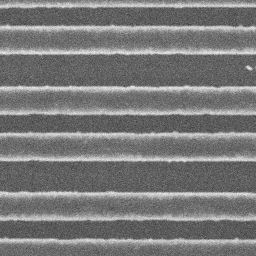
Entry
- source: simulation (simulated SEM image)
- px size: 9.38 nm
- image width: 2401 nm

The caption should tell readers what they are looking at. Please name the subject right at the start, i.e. lines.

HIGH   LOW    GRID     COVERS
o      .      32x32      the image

oooooooooooooooooooooooooooooooo
................................
................................
oooooooooooooooooooooooooooooooo
oooooooooooooooooooooooooooooooo
oooooooooooooooooooooooooooooooo
oooooooooooooooooooooooooooooooo
................................
................................
................................
................................
oooooooooooooooooooooooooooooooo
oooooooooooooooooooooooooooooooo
oooooooooooooooooooooooooooooooo
................................
................................
................................
oooooooooooooooooooooooooooooooo
oooooooooooooooooooooooooooooooo
oooooooooooooooooooooooooooooooo
................................
................................
................................
................................
oooooooooooooooooooooooooooooooo
oooooooooooooooooooooooooooooooo
oooooooooooooooooooooooooooooooo
................................
................................
................................
oooooooooooooooooooooooooooooooo
oooooooooooooooooooooooooooooooo